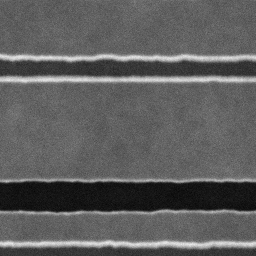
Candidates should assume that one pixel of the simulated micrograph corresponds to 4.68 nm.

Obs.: lines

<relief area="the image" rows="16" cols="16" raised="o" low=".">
oooooooooooooooo
oooooooooooooooo
oooooooooooooooo
oooooooooooooooo
oooooooooooooooo
oooooooooooooooo
oooooooooooooooo
oooooooooooooooo
oooooooooooooooo
oooooooooooooooo
oooooooooooooooo
................
................
oooooooooooooooo
oooooooooooooooo
oooooooooooooooo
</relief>